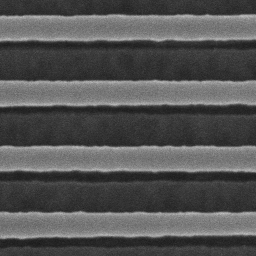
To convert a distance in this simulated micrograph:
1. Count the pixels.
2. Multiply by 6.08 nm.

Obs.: lines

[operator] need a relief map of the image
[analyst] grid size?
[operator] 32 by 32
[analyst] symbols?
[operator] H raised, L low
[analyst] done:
LLLLLLLLLLLLLLLLLLLLLLLLLLLLLLLL
LLLLLLLLLLLLLLLLLLLLLLLLLLLLLLLL
HHHHHHHHHHHHHHHHHHHHHHHHHHHHHHHH
HHHHHHHHHHHHHHHHHHHHHHHHHHHHHHHH
HHHHHHHHHHHHHHHHHHHHHHHHHHHHHHHH
LLLLLLLLLLLLLLLLLLLLLLLLLLLLLLLL
LLLLLLLLLLLLLLLLLLLLLLLLLLLLLLLL
LLLLLLLLLLLLLLLLLLLLLLLLLLLLLLLL
LLLLLLLLLLLLLLLLLLLLLLLLLLLLLLLL
LLLLLLLLLLLLLLLLLLLLLLLLLLLLLLLL
HHHHHHHHHHHHHHHHHHHHHHHHHHHHHHHH
HHHHHHHHHHHHHHHHHHHHHHHHHHHHHHHH
HHHHHHHHHHHHHHHHHHHHHHHHHHHHHHHH
LLLLLLLLLLLLLLLLLLLLLLLLLLLLLLLL
LLLLLLLLLLLLLLLLLLLLLLLLLLLLLLLL
LLLLLLLLLLLLLLLLLLLLLLLLLLLLLLLL
LLLLLLLLLLLLLLLLLLLLLLLLLLLLLLLL
LLLLLLLLLLLLLLLLLLLLLLLLLLLLLLLL
HHHHHHHHHHHHHHHHHHHHHHHHHHHHHHHH
HHHHHHHHHHHHHHHHHHHHHHHHHHHHHHHH
HHHHHHHHHHHHHHHHHHHHHHHHHHHHHHHH
LLLLLLLLLLLLLLLLLLLLLLLLLLLLLLLL
LLLLLLLLLLLLLLLLLLLLLLLLLLLLLLLL
LLLLLLLLLLLLLLLLLLLLLLLLLLLLLLLL
LLLLLLLLLLLLLLLLLLLLLLLLLLLLLLLL
LLLLLLLLLLLLLLLLLLLLLLLLLLLLLLLL
LLLLLLLLLLLLLLLLLLLLLLLLLLLLLLLL
HHHHHHHHHHHHHHHHHHHHHHHHHHHHHHHH
HHHHHHHHHHHHHHHHHHHHHHHHHHHHHHHH
HHHHHHHHHHHHLLLHHHHHLLLLLLLLLLLL
LLLLLLLLLLLLLLLLLLLLLLLLLLLLLLLL
LLLLLLLLLLLLLLLLLLLLLLLLLLLLLLLL